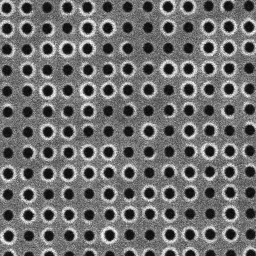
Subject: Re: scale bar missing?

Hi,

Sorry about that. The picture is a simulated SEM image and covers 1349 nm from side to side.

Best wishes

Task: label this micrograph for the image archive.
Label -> a regular array of holes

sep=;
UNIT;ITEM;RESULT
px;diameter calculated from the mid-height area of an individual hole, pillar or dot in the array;10.8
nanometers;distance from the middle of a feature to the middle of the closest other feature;105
